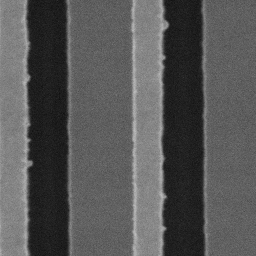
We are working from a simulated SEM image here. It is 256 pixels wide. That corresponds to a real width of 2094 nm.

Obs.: lines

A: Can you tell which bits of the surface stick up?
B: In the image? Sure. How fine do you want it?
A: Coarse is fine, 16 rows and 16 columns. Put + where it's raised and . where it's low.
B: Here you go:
++..++++++...+++
++..++++++...+++
++..++++++...+++
++..++++++...+++
++..++++++...+++
++..++++++...+++
++..++++++...+++
++..++++++...+++
++..++++++...+++
++..++++++...+++
++..++++++...+++
++..++++++...+++
++..++++++...+++
++..++++++...+++
++..++++++...+++
++..++++++...+++